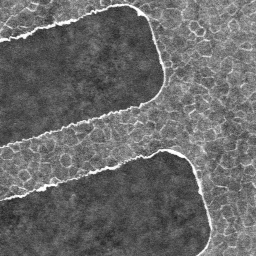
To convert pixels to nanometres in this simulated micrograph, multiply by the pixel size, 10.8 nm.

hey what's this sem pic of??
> one or a few lines or trenches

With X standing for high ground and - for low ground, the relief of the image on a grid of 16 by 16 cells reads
XXXXXXX-XXXXXXXX
XXXX-----XXXXXXX
----------XXXXXX
----------XXXXXX
----------XXXXXX
----------XXXXXX
---------XXXXXXX
------XXXXXXXXXX
--XXXXXXXXXXXXXX
XXXXXXXXXXXXXXXX
XXXXXXX-----XXXX
XXXX--------XXXX
-------------XXX
-------------XXX
-------------XXX
-------------XXX